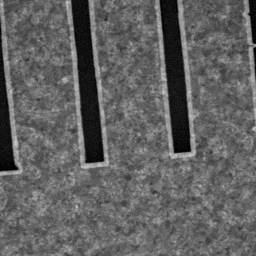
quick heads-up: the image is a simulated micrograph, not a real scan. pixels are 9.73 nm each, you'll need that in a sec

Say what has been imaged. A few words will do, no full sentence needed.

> one or a few lines or trenches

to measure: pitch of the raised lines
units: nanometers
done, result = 865